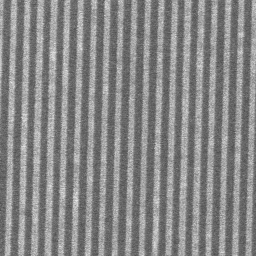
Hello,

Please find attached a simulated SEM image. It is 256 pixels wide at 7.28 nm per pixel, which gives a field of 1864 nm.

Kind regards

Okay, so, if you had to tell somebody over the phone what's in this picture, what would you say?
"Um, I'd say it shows parallel lines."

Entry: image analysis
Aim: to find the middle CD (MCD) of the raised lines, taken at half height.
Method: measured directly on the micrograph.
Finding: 34.6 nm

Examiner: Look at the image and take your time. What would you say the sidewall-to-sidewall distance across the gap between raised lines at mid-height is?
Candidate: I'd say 8.63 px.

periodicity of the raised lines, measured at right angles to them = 97.4 nanometers